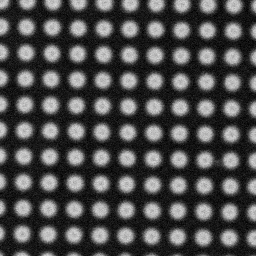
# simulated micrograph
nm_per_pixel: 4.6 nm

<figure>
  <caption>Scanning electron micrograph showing an array of small figures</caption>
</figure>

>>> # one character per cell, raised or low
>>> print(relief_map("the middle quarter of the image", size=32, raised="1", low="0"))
00000000000000000000000000000000
00000000000000000000000000000000
00111000011000011000001000000000
01111000111000111100011100001110
01111000111100111100011100011110
00111000111000011100011100011110
00000000000000000000000000000000
00000000000000000000000000000000
00000000000000000000000000000000
01111000111000011100011100001100
01111000111000111100011110011110
00111000111000111100011100011110
00000000000000001000001000001100
00000000000000000000000000000000
00000000000000000000000000000000
00110000111000011000000000000000
01111000111000111100011100011110
01111000111000111100011100011110
00110000111000011000011100011100
00000000000000000000000000000000
00000000000000000000000000000000
00000000000000000000000000000000
01111000111000111000011100011100
01111001111000111100111100011110
01110000111000111100111100011110
00000000000000000000011000001100
00000000000000000000000000000000
00000000000000000000000000000000
01110000110000011000001000000000
01111001111000111000111100011100
01111001111000111000111100011100
00110000110000111000011100011100